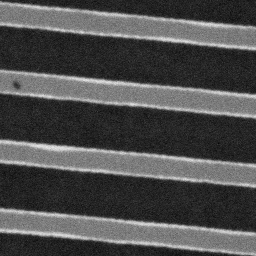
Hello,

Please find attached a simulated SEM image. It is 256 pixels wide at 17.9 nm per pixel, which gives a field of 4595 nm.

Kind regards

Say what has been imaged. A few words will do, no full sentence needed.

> lines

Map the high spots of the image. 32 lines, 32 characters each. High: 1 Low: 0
10000000000000000000000000000000
11111111111100000000000000000000
11111111111111111111110000000000
00000111111111111111111111111111
00000000000000011111111111111111
00000000000000000000000001111111
00000000000000000000000000000000
00000000000000000000000000000000
00000000000000000000000000000000
11111110000000000000000000000000
11111111111111111000000000000000
11111111111111111111111111100000
00000000001111111111111111111111
00000000000000000000111111111111
00000000000000000000000000000001
00000000000000000000000000000000
00000000000000000000000000000000
00000000000000000000000000000000
11111111000000000000000000000000
11111111111111111111100000000000
00111111111111111111111111111100
00000000000001111111111111111111
00000000000000000000000111111111
00000000000000000000000000000000
00000000000000000000000000000000
00000000000000000000000000000000
11110000000000000000000000000000
11111111111111000000000000000000
11111111111111111111111111000000
00000001111111111111111111111111
00000000000000000001111111111111
00000000000000000000000000001111